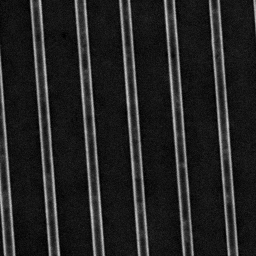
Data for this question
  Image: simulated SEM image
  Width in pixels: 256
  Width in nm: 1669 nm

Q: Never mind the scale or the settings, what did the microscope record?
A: parallel lines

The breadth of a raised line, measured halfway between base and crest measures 62.6 nm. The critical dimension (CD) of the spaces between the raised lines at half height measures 0.227 um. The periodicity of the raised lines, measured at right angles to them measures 44.6 px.